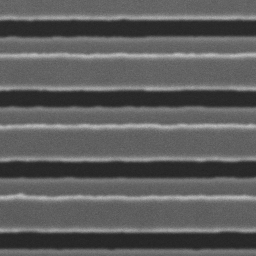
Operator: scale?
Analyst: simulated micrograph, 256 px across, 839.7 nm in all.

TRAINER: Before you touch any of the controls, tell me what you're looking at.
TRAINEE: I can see lines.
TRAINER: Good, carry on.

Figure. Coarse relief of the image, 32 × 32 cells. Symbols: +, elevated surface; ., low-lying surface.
++++++++++++++++++++++++++++++++
++++++++++++++++++++++++++++++++
...+.........+..................
................................
................................
++++++++++++++++++++++++++++++++
++++++++++++++++++++++++++++++++
++++++++++++++++++++++++++++++++
++++++++++++++++++++++++++++++++
++++++++++++++++++++++++++++++++
++++++++++++++++++++++++++++++++
................................
................................
.+..++...+..+..+++..+..+++......
++++++++++++++++++++++++++++++++
++++++++++++++++++++++++++++++++
++++++++++++++++++++++++++++++++
++++++++++++++++++++++++++++++++
++++++++++++++++++++++++++++++++
++++++++++++++++++++++++++++++++
................................
................................
++++++++++++++++++++++++++++++++
++++++++++++++++++++++++++++++++
++++++++++++++++++++++++++++++++
++++++++++++++++++++++++++++++++
++++++++++++++++++++++++++++++++
++++++++++++++++++++++++++++++++
++++++++++++++++++++++++++++++++
................................
................................
++++++++++++++++++++++++++++++++